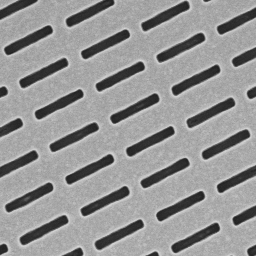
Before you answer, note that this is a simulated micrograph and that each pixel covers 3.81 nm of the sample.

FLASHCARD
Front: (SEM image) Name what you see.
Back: a regular array of holes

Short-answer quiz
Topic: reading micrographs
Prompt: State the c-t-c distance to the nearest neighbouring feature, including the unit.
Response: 35.5 pixels